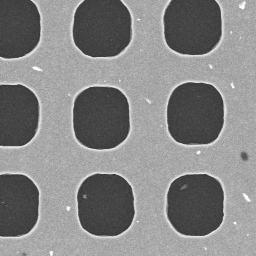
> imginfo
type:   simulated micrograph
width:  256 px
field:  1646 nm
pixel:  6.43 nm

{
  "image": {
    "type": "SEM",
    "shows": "holes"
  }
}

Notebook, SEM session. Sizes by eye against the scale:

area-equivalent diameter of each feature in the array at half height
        399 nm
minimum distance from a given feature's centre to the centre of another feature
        568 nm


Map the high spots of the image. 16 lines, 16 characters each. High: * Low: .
..***...**....**
...**...**....**
..***...**....**
.*****.*********
****************
..****.****..***
..***...**....**
..***...**....**
..***...***...**
****************
****************
..***...***...**
..***...**....**
..***...**....**
..****..***..***
****************